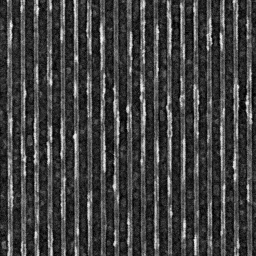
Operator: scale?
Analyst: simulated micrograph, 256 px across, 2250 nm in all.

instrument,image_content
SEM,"parallel lines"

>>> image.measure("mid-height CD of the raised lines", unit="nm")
35.2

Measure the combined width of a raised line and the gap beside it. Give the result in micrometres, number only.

0.117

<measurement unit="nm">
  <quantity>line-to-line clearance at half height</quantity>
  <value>83.5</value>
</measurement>